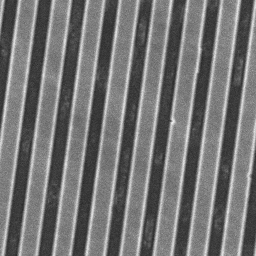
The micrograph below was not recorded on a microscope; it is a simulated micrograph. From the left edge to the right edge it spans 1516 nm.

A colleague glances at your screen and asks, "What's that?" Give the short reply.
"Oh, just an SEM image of parallel lines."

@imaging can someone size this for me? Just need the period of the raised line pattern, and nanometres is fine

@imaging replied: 198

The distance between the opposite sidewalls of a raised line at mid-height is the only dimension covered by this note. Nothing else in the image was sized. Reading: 116 nm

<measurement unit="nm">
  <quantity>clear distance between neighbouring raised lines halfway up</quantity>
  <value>81.3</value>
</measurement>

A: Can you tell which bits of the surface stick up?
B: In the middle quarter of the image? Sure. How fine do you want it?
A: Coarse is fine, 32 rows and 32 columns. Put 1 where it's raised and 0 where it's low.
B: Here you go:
00001111000011110000111110000111
00011111000011110000111110001111
00011111000111110000111110001111
00011111000111110000111110001111
00011111000111110000111100001111
00011110000111110000111100001111
00011110000111110000111100001111
00011110000111110001111100001111
00111110000111100001111100011111
00111110000111100001111100011111
00111110001111100001111100011111
00111110001111100001111000011111
00111100001111100001111000011111
00111100001111100011111000011111
00111100001111100011111000011110
00111100001111100011111000011110
01111100001111000011111000111110
01111100011111000011111000111110
01111100011111000011111000111110
01111100011111000011110000111110
01111000011111000111110000111110
01111000011111000111110000111110
01111000011111000111110000111100
11111000011110000111110001111100
11111000011110000111110001111100
11111000111110000111110001111100
11111000111110000111100001111100
11111000111110000111100001111100
11110000111110001111100001111100
11110000111110001111100001111000
11110000111110001111100001111000
11110000111110001111100011111000